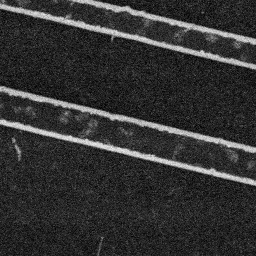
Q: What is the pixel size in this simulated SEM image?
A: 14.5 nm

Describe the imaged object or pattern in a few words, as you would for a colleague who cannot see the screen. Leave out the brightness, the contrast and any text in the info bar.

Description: one or a few lines or trenches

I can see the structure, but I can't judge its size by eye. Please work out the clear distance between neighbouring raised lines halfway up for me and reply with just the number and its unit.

1170 nm